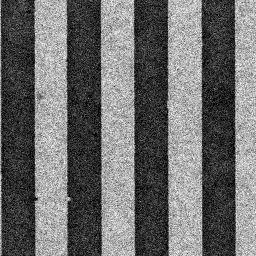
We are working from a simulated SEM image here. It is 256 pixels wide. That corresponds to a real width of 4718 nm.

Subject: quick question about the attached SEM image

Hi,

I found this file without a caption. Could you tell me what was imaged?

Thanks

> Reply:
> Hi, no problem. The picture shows one or a few lines or trenches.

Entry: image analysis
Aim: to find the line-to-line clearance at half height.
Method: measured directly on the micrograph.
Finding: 34.7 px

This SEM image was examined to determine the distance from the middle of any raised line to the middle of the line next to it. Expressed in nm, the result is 1240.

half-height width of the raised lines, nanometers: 592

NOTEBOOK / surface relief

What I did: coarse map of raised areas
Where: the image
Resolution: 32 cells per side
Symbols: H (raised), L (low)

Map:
LLLLHHHHLLLLLHHHHLLLLHHHHLLLLLHH
LLLLHHHHLLLLLHHHHLLLLHHHHLLLLLHH
LLLLHHHHLLLLLHHHHLLLLHHHHLLLLLHH
LLLLHHHHLLLLLHHHHLLLLHHHHLLLLLHH
LLLLHHHHLLLLLHHHHLLLLHHHHLLLLLHH
LLLLHHHHLLLLLHHHHLLLLHHHHLLLLLHH
LLLLHHHHLLLLLHHHHLLLLHHHHLLLLLHH
LLLLHHHHLLLLLHHHHLLLLHHHHLLLLLHH
LLLLHHHHLLLLLHHHHLLLLHHHHLLLLLHH
LLLLHHHHLLLLLHHHHLLLLHHHHLLLLLHH
LLLLHHHHLLLLLHHHHLLLLHHHHLLLLLHH
LLLLHHHHLLLLLHHHHLLLLHHHHLLLLLHH
LLLLHHHHLLLLLHHHHLLLLHHHHLLLLLHH
LLLLHHHHLLLLLHHHHLLLLHHHHLLLLLHH
LLLLHHHHLLLLLHHHHLLLLHHHHLLLLLHH
LLLLHHHHLLLLLHHHHLLLLHHHHLLLLLHH
LLLLHHHHLLLLLHHHHLLLLHHHHLLLLLHH
LLLLHHHHLLLLLHHHHLLLLHHHHLLLLLHH
LLLLHHHHLLLLLHHHHLLLLHHHHLLLLLHH
LLLLHHHHLLLLLHHHHLLLLHHHHLLLLLHH
LLLLHHHHLLLLLHHHHLLLLHHHHLLLLHHH
LLLLHHHHLLLLLHHHHLLLLHHHHLLLLLHH
LLLLHHHHLLLLLHHHHLLLLHHHHLLLLLHH
LLLLHHHHLLLLLHHHHLLLLHHHHLLLLLHH
LLLLHHHHLLLLLHHHHLLLLHHHHLLLLLHH
LLLLHHHHLLLLLHHHHLLLLHHHHLLLLLHH
LLLLHHHHLLLLLHHHHLLLLHHHHLLLLLHH
LLLLHHHHLLLLLHHHHLLLLHHHHLLLLLHH
LLLLHHHHLLLLLHHHHLLLLHHHHLLLLLHH
LLLLHHHHLLLLLHHHHLLLLHHHHLLLLLHH
LLLLHHHHLLLLLHHHHLLLLHHHHLLLLLHH
LLLLHHHHLLLLLHHHHLLLLHHHHLLLLLHH